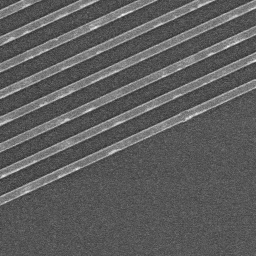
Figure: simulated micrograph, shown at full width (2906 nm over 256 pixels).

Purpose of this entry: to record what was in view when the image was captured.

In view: parallel lines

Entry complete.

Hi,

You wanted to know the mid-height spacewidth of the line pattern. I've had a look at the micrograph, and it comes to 188 nanometers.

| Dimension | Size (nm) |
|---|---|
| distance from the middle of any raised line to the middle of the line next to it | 274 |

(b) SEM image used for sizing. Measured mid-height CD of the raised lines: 89 nanometers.